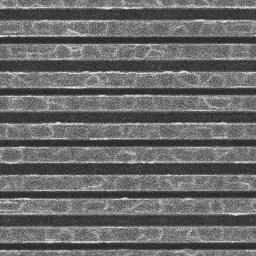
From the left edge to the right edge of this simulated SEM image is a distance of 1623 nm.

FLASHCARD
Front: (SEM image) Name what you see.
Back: parallel lines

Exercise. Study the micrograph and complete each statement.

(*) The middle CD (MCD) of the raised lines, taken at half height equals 108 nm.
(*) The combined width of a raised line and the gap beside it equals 163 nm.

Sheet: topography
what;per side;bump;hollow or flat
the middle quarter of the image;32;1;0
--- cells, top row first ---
00000000000000000000000000000000
00000000000000000000000000000000
11111111111111111111111111111111
11111111111111111111111111111111
11111111111111111111111111111111
11111111111111111111111111111111
00000000000000000000000000000000
00000000000000000000000000000000
11111111111111111111111111111111
11111111111111111111111111111111
11111111111111111111111111111111
11111111111111111111111111111111
00000000000000000000000000000000
00000000000000000000000000000000
00000000000000000000000000000000
11111111111111111111111111111111
11111111111111111111111111111111
11111111111111111111111111111111
11111111111111111111111111111111
00000000000000000000000000000000
00000000000000000000000000000000
11111111111111111111111111111111
11111111111111111111111111111111
11111111111111111111111111111111
11111111111111111111111111111111
00000000000000000000000000000000
00000000000000000000000000000000
00000000000000000000000000000000
11111111111111111111111111111111
11111111111111111111111111111111
11111111111111111111111111111111
11111111111111111111111111111111